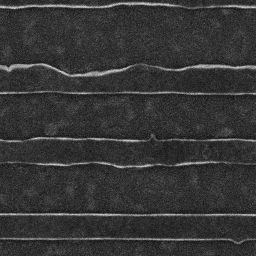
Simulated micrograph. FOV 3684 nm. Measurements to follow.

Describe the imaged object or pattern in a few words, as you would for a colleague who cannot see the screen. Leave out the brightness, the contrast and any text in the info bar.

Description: one or a few lines or trenches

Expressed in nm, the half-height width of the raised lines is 361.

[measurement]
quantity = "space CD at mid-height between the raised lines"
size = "0.722 um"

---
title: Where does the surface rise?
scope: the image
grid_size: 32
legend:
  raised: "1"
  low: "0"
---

11111111111111100000111111111111
00000000000000000000000000000000
00000000000000000000000000000000
00000000000000000000000000000000
00000000000000000000000000000000
00000000000000000000000000000000
00000000000000000000000000000000
00000000000000000000000000000000
11111110000000001111000111111111
11111111111111111111111111111111
11111111111111111111111111111111
11111011111111111111111111111111
00000000000000000000000000000000
00000000000000000000000000000000
00000000000000000000000000000000
00000000000000000000000000000000
00000000000000000000000000000000
00011111111111100011010000001110
11111111111111111111111111111111
11111111111111111111111111111111
00000011100000111111111100000011
00000000000000000000000000000000
00000000000000000000000000000000
00000000000000000000000000000000
00000000000000000000000000000000
00000000000000000000000000000000
00000000000000000000000000000000
11111111111111111111111111111111
11111111111111111111111111111111
11111111111111111111111111111111
00000000000000000000000000000000
00000000000000000000000000000000